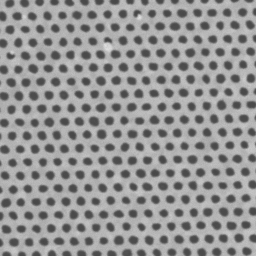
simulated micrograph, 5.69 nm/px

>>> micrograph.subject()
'a regular array of holes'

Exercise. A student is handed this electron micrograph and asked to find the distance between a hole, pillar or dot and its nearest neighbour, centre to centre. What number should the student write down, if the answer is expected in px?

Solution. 14.6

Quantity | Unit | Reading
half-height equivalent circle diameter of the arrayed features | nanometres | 51.7